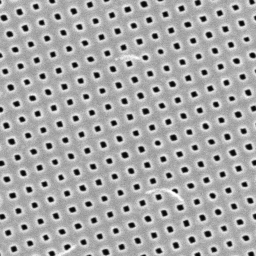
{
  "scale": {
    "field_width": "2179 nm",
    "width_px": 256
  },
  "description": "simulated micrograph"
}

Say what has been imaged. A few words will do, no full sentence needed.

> a regular array of holes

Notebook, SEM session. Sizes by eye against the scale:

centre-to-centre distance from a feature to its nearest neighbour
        143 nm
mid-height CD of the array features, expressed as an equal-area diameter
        54.3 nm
